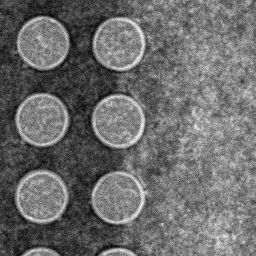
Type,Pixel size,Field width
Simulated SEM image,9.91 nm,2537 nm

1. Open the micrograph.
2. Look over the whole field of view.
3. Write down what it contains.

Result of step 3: raised bodies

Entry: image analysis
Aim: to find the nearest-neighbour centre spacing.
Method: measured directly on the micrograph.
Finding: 76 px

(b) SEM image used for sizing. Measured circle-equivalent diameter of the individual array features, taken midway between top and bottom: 512 nm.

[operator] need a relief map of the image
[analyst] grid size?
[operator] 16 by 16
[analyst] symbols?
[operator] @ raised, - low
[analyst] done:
----------------
--@@--@@--------
-@@@--@@@-------
-@@@--@@@-------
----------------
----------------
-@@@--@@--------
-@@@--@@@-------
-@@@--@@@-------
----------------
----------------
-@@@--@@@-------
-@@@--@@@-------
--@@--@@--------
----------------
----------------